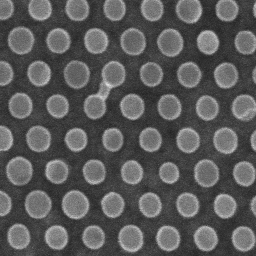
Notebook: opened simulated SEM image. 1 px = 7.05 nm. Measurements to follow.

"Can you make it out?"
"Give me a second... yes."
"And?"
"a regular array of raised bodies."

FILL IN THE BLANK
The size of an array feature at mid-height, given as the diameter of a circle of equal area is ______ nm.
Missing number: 164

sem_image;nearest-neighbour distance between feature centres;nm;262